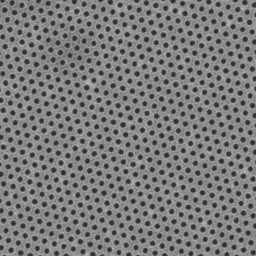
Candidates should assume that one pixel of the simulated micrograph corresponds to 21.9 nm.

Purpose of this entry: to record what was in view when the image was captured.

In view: a regular array of holes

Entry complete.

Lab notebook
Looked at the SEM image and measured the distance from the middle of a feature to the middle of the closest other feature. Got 0.214 µm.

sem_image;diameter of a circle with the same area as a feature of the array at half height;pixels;5.75